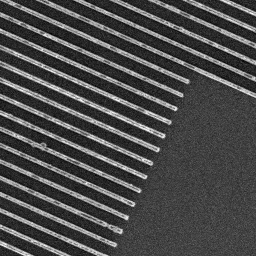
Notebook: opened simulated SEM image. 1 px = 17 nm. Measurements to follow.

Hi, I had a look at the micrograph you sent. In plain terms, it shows parallel lines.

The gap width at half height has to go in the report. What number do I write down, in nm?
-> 200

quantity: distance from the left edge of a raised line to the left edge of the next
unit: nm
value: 254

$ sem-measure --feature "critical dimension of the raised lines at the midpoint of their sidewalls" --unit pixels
3.88